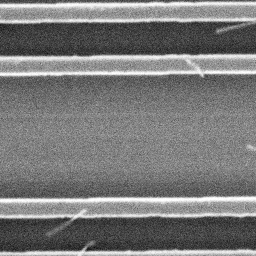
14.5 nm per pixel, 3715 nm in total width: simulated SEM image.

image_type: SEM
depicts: lines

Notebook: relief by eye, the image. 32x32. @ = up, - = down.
---------@@@@@@@@@@@@@@@@@@@@@@@
@@@@@@@@@@@@@@@@@@@@@@@@@@@@@@@@
@@@@@@@@@@@@@@@@@@@@@@@@@@@@@@@@
--------------------------------
--------------------------------
--------------------------------
--------------------------------
@@@@@@@@@@@@@@@@@@@@@@@@@@@@@@@@
@@@@@@@@@@@@@@@@@@@@@@@@@@@@@@@@
--------------------------------
--------------------------------
--------------------------------
--------------------------------
--------------------------------
--------------------------------
--------------------------------
--------------------------------
--------------------------------
--------------------------------
--------------------------------
--------------------------------
--------------------------------
--------------------------------
--------------------------------
--------------------------------
@@@@@@@@@@@@@@@@@@@@@@@@@@@@@@@@
@@@@@@@@@@@@@@@@@@@@@@@@@@@@@@@@
--------------------------------
--------------------------------
--------------------------------
--------------------------------
----------@--------@@@@@@@@@@@@@